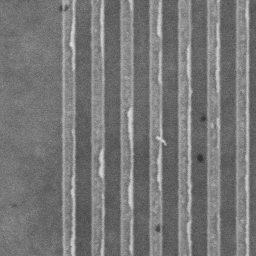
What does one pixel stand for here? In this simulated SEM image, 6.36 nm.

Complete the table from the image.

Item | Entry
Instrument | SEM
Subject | parallel lines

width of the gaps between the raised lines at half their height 107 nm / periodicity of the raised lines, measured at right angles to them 0.184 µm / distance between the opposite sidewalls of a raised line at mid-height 75.5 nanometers